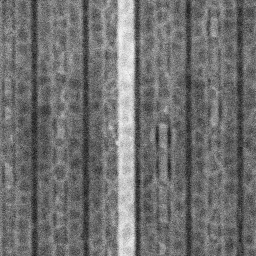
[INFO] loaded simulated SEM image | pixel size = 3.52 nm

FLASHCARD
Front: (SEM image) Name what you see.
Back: parallel lines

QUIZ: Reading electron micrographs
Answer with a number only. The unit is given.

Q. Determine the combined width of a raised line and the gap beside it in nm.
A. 90.5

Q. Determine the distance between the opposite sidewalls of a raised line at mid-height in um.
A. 0.0537